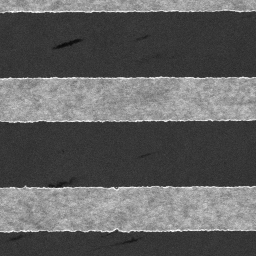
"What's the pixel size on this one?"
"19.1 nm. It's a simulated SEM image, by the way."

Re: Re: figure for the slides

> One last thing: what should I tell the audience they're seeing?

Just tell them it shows one or a few lines or trenches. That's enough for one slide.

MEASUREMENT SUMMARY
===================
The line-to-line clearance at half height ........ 1260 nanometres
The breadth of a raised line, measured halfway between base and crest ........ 824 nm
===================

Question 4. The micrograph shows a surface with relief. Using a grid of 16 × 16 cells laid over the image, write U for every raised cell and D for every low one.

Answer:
UUUUUUUUUUUUUUUU
DDDDDDDDDDDDDDDD
DDDDDDDDDDDDDDDD
DDDDDDDDDDDDDDDD
DDDDDDDDDDDDDDDD
UUUUUUUUUUUUUUUU
UUUUUUUUUUUUUUUU
UUUUUUUUUUUUUUUU
DDDDDDDDDDDDDDDD
DDDDDDDDDDDDDDDD
DDDDDDDDDDDDDDDD
DDDDDDDDDDDDDDDD
UUUUUUUUUUUUUUUU
UUUUUUUUUUUUUUUU
DDDDDDDDDDDDDDDD
DDDDDDDDDDDDDDDD